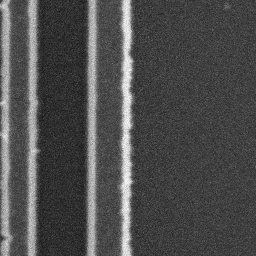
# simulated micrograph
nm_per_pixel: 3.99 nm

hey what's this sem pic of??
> one or a few lines or trenches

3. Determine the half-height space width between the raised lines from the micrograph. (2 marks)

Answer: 235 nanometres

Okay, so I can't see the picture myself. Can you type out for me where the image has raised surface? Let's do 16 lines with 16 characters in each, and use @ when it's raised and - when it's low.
@@----@@--------
@@----@@--------
@@----@@--------
@@----@@--------
@@----@@--------
@@----@@--------
@@----@@--------
@@----@@--------
@@----@@--------
@@----@@--------
@@----@@--------
@@----@@--------
@@----@@--------
@@----@@--------
@@----@@--------
@@----@@--------